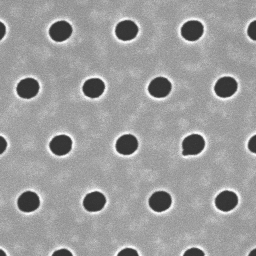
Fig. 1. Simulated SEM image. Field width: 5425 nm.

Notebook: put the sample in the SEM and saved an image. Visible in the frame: a regular array of holes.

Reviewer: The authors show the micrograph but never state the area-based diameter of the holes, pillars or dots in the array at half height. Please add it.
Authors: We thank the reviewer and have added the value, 484 nanometers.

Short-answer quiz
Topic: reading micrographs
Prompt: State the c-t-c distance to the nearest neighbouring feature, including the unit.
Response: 1380 nanometers